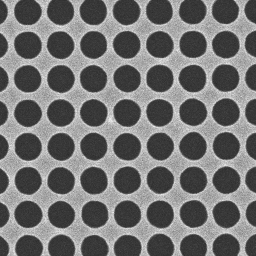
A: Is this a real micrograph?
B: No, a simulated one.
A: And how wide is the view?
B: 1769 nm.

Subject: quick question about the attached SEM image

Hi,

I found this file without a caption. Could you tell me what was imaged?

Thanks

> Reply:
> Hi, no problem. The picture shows a regular array of holes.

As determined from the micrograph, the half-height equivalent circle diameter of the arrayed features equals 27.5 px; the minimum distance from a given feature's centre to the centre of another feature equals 227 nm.